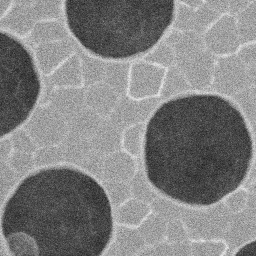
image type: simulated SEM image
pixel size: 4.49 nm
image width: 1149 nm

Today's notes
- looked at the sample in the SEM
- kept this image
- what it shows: holes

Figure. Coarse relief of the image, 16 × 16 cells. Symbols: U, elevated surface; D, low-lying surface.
UUUUDDDDDDDUUUUU
UUUUDDDDDDDUUUUU
DUUUUDDDDDUUUUUU
DDUUUUDDDUUUUUUU
DDUUUUUUUUUUUUUU
DDDUUUUUUUUUUUUU
DDUUUUUUUUDDDDDU
DDUUUUUUUDDDDDDU
UUUUUUUUUDDDDDDD
UUUUUUUUUDDDDDDD
UUUDDUUUUDDDDDDD
UDDDDDUUUDDDDDDU
UDDDDDDUUUUDDDUU
DDDDDDDUUUUUUUUU
DDDDDDDUUUUUUUUU
UDDDDDDUUUUUUUUD